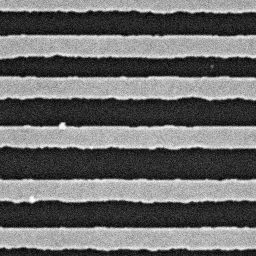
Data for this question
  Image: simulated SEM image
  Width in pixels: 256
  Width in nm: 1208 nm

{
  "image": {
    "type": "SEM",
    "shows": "lines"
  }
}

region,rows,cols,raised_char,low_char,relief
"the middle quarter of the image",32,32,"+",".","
................................
................................
................................
++++++++++++++++++++++++++++++++
++++++++++++++++++++++++++++++++
++++++++++++++++++++++++++++++++
++++++++++++++++++++++++++++++++
++++++++++++++++++++++++++++++++
++...++++++.+++++++++++++++++...
................................
................................
................................
................................
................................
................................
+.........................+.....
++++++++++++++++++++++++++++++++
++++++++++++++++++++++++++++++++
++++++++++++++++++++++++++++++++
++++++++++++++++++++++++++++++++
++++++++++++++++++++++++++++++++
................................
................................
................................
................................
................................
................................
................................
................................
++++++++++++++++++++++++++++++++
++++++++++++++++++++++++++++++++
++++++++++++++++++++++++++++++++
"